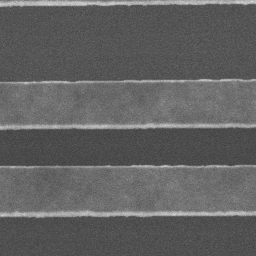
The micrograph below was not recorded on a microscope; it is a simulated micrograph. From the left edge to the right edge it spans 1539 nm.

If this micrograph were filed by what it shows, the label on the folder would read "lines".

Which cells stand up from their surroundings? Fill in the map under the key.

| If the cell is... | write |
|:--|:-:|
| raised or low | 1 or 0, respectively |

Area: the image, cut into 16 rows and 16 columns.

0000000000000000
0000000000000000
0000000000000000
0000000000000000
0000000000000000
1111111111111111
1111111111111111
1111111111111111
0000000000000000
0000000000000000
1111111111111111
1111111111111111
1111111111111111
1111000000000000
0000000000000000
0000000000000000